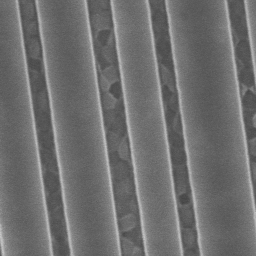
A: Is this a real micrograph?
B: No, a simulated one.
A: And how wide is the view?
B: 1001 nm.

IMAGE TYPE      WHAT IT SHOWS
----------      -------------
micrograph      one or a few lines or trenches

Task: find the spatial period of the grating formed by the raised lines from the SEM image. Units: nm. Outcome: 262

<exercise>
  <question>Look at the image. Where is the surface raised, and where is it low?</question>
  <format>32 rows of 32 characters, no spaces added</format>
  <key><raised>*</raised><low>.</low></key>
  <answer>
**...******...*****..*******...*
**...******...*****..*******...*
***..******...*****..********..*
***..******...*****..********..*
***..******...*****..********..*
***..******....****..********..*
***..*******...****...*******..*
***..*******...*****..*******...
***...******...*****..*******...
***...******...*****..********..
****..******...*****..********..
****..******...*****..********..
****..******....****..********..
****..*******...****...*******..
****..*******...****...*******..
****...******...*****..*******..
****...******...*****..********.
*****..******...*****..********.
*****..******...*****..********.
*****..******....****..********.
*****..*******...****..********.
*****..*******...****...*******.
*****...******...*****..*******.
*****...******...*****..*******.
******..******...*****..********
******..******...*****..********
******..******....****..********
******..******....****..********
******..*******...****...*******
******...******...*****..*******
******...******...*****..*******
*******..******...*****..*******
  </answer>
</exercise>